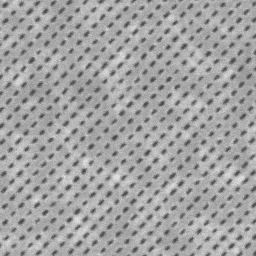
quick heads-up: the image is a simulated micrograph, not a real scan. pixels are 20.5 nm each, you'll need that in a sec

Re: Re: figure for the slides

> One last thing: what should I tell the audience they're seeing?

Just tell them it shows a regular array of holes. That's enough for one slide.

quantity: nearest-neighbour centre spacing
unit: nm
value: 228